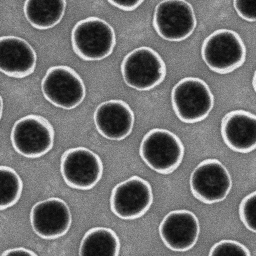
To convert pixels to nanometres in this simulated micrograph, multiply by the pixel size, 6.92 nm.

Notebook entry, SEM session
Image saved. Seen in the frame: a regular array of raised bodies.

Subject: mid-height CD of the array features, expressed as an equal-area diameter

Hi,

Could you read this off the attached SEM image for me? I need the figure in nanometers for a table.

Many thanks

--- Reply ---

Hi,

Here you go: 285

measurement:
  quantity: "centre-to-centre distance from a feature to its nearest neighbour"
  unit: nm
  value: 400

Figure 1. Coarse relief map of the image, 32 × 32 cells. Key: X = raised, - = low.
---XXXXX------XXX---XXXX-----XXX
---XXXXX-----------XXXXX------XX
----XXX----XX------XXXXX-------X
-----X---XXXXX------XXXX--------
---------XXXXX------XXX---XXXX--
XXXX-----XXXXX------------XXXX--
XXXX------XXXX--XXX------XXXXXX-
XXXX-----------XXXXX------XXXX--
XXXX---X-------XXXXX------XXX---
------XXXX-----XXXXX------------
-----XXXXX------XXXX--XXXX------
-----XXXXXX-----------XXXX------
------XXXX------------XXXXX-----
--------X---XXXX------XXXX------
------------XXXXX-----XXXX---XX-
--XXXX------XXXXX-----------XXXX
--XXXX-------XXX---XX-------XXXX
-XXXXX------------XXXX------XXXX
--XXXX------------XXXXX------XXX
---X----XXXX------XXXXX---------
--------XXXXX------XXX---XXX----
XX------XXXXX-----------XXXX----
XX------XXXX----XX------XXXXX---
XXX-----------XXXXX-----XXXXX---
XX------------XXXXX------XXX---X
X----XXX------XXXXX-----------XX
----XXXXX-----XXXX----X-------XX
----XXXXX-----------XXXXX-----XX
----XXXX------------XXXXX------X
-----XX----XXX------XXXXX-------
----------XXXXX------XXX---XXX--
-XXX------XXXXX-----------XXXXX-